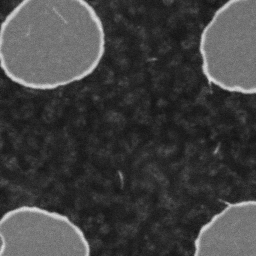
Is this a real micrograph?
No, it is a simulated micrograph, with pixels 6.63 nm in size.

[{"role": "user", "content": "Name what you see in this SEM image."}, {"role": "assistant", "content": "raised bodies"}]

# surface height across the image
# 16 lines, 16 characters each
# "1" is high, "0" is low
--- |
0111110000000011
1111110000000111
1111110000000111
1111110000000111
1111110000000111
0000000000000011
0000000000000000
0000000000000000
0000000000000000
0000000000000000
0000000000000000
0000000000000000
0000000000000000
1111000000000011
1111100000000111
1111100000001111